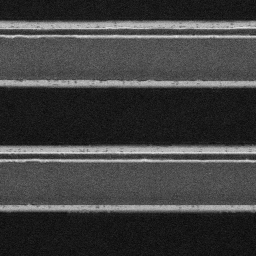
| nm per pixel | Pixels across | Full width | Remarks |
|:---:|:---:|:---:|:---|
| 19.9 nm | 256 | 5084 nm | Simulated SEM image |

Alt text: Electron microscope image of lines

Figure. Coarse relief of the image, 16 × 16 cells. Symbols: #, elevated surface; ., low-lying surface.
################
################
................
................
................
################
################
################
################
................
................
................
................
################
################
################